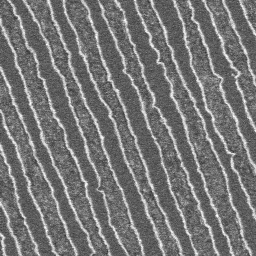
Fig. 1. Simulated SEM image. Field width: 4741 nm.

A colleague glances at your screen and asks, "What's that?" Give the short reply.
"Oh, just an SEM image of parallel lines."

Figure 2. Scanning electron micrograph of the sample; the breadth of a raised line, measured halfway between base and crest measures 306 nanometres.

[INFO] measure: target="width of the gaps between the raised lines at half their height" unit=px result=16.5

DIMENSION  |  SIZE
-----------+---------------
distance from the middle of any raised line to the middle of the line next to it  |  612 nanometers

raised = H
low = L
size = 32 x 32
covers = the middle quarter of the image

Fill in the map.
LHHHHHLLLLHHHHHLLLLHHHHHHLLLHHHH
LLHHHHLLLLLHHHHLLLLLHHHHHLLLHHHH
LLHHHHHLLLLHHHHHLLLLHHHHHLLLLHHH
LLLHHHHLLLLHHHHHHLLLHHHHHHLLLHHH
LLLHHHHHLLLLHHHHHLLLHHHHHHHLLLHH
LLLLHHHHLLLLHHHHHHLLLHHHHHHLLLHH
HLLLHHHHLLLLLHHHHHLLLHHHHHHLLLLH
HLLLLHHHHLLLLHHHHHHLLLHHHHHLLLLH
HLLLLHHHHLLLLLHHHHHLLLHHHHHLLLLL
HLLLLHHHHHLLLLHHHHHHLLHHHHHHLLLL
HHLLLHHHHHHLLLLHHHHHLLHHHHHHLLLL
HHLLLLHHHHHLLLLHHHHHLLLHHHHHHLLL
HHHLLLLHHHHHLLLHHHHHLLLLHHHHHLLL
HHHLLLLHHHHHLLLLHHHHLLLLHHHHHHLL
HHHLLLLLHHHHHLLLHHHHHLLLLHHHHHLL
HHHHLLLLHHHHHLLLHHHHHLLLLLHHHHLL
HHHHLLLLLHHHHLLLLHHHHHLLLLHHHHHL
HHHHHLLLLHHHHLLLLHHHHHLLLLLHHHHL
HHHHHLLLLHHHHHLLLLHHHHHLLLLHHHHL
HHHHHLLLLHHHHHLLLLHHHHHLLLLLHHHL
LHHHHLLLLHHHHHLLLLHHHHHHLLLLHHHH
LHHHHHLLLLHHHHHLLLLHHHHHLLLLHHHH
LLHHHHLLLLHHHHHLLLLHHHHHLLLLHHHH
LLHHHHLLLLLHHHHLLLLHHHHHLLLLLHHH
LLLHHHHLLLLHHHHHLLLLHHHHHLLLLHHH
LLLHHHHLLLLHHHHHLLLLHHHHHLLLLLHH
LLLLHHHHLLLLHHHHHLLLHHHHHLLLLLHH
LLLLHHHHLLLLHHHHHLLLLHHHHHLLLLLH
LLLLHHHHHLLLLHHHHHLLLHHHHHLLLLLH
LLLLLHHHHLLLLHHHHHLLLHHHHHLLLLLH
LLLLLHHHHLLLLLHHHHLLLLHHHHHLLLLL
HLLLLHHHHLLLLLHHHHHLLLHHHHHLLLLL